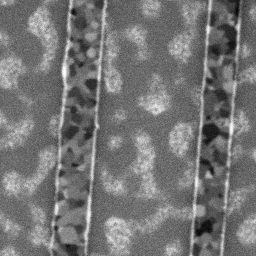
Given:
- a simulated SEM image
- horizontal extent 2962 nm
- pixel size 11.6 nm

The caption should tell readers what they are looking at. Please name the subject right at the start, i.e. one or a few lines or trenches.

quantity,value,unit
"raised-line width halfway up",364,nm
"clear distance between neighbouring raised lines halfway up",105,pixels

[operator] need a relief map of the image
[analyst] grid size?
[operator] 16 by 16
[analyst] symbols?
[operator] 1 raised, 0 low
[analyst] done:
0000111000000110
0000110000000110
0000110000000110
0000110000000110
0000110000000110
0000110000000110
0000110000000110
0000110000000100
0000110000001100
0000110000001100
0000110000001100
0000110000001100
0000110000001100
0001110000001100
0001100000001100
0001100000001100